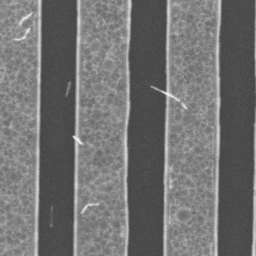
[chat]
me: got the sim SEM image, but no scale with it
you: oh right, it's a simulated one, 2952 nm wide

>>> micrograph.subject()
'one or a few lines or trenches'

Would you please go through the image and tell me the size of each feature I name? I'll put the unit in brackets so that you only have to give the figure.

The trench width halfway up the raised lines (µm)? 0.447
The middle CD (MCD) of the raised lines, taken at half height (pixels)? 50.5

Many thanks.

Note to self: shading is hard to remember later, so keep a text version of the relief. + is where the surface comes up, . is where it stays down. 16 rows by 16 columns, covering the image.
++...+++...+++..
++...+++...+++..
++...+++...+++..
++...+++..++++..
++...+++..++++..
++...+++..++++..
++...+++...+++..
++...+++..++++..
++...+++..++++..
++...+++..++++..
++...+++..++++..
++...+++..++++..
++...+++..++++..
++...+++..++++..
++...+++..+++...
++...+++..+++...